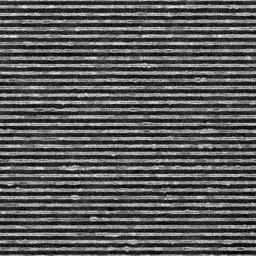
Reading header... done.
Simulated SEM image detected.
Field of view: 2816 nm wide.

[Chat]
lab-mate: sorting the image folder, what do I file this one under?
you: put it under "parallel lines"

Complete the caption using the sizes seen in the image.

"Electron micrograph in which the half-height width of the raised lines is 31.6 nm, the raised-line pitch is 0.0808 microns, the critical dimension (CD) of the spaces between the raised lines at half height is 52.3 nm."